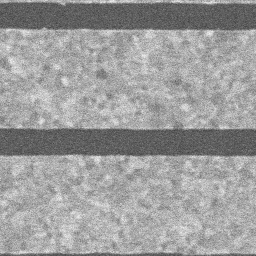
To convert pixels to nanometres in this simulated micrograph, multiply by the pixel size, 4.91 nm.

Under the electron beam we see one or a few lines or trenches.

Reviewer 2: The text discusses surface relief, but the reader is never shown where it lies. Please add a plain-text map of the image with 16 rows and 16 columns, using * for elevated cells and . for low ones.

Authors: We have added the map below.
................
................
****************
****************
****************
****************
****************
****************
................
................
****************
****************
****************
****************
****************
****************